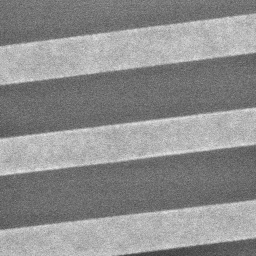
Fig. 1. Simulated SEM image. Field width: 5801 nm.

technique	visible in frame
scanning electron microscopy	lines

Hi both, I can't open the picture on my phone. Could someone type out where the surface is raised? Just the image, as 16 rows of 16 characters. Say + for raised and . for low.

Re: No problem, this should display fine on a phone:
................
...........+++++
...+++++++++++++
++++++++++++++..
++++++..........
................
................
..........++++++
..++++++++++++++
++++++++++++....
++++............
................
................
........++++++++
++++++++++++++++
+++++++++++.....